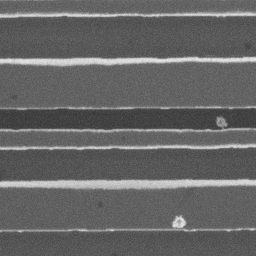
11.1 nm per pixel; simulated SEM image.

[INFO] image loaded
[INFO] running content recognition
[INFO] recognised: lines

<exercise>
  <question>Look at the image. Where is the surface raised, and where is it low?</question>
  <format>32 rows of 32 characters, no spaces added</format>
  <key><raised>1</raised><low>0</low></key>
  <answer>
11111111111111111111111111111111
11111111111111111111111111111111
00000000000000000000000000000000
00000000000000000000000000000000
00000000000000000000000000000000
00000000000000000000000000000000
00000000000000000000000000000000
00000000000000000000001111100111
11111111111111111111111111111111
11111111111111111111111111111111
11111111111111111111111111111111
11111111111111111111111111111111
11111111111111111111111111111111
11111111111111111000110000001000
00000000000000000000000000000000
00000000000000000000000000000000
11111111111111111111111111111111
11111111111111111111111111111111
11111111111111011110000111100000
00000000000000000000000000000000
00000000000000000000000000000000
00000000000000000000000000000000
00000000000000000000000000000000
11111111111111111111111111111111
11111111111111111111111111111111
11111111111111111111111111111111
11111111111111111111111111111111
11111111111111111111111111111111
11111111111111111111111111111111
00000000000000000000000000000000
00000000000000000000000000000000
00000000000000000000000000000000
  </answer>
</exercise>